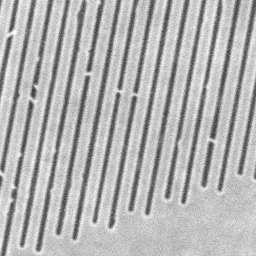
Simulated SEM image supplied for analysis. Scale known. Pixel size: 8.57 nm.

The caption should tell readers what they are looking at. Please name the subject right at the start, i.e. parallel lines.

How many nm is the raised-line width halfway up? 92.6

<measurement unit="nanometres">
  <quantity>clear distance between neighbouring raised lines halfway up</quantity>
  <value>53.7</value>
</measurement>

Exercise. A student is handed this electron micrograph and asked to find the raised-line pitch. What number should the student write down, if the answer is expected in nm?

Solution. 144